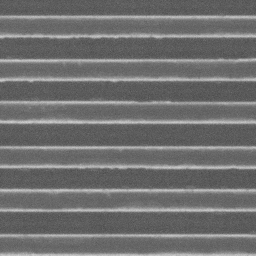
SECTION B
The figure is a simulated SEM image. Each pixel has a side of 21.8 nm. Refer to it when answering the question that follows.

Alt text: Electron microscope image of lines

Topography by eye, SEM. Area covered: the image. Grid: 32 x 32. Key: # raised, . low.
................................
................................
################################
################################
###########################....#
................................
................................
................................
################################
################################
................................
................................
................................
################################
################################
................................
................................
................................
################################
################################
################################
................................
................................
................................
################################
################################
................................
................................
................................
#############################...
################################
################################